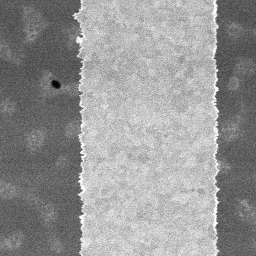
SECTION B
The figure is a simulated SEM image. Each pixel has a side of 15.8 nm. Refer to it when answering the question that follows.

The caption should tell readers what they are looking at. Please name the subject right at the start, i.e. one or a few lines or trenches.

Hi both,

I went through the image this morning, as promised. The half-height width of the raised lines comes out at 2140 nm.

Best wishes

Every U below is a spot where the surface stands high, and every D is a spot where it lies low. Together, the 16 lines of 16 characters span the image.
DDDDDUUUUUUUUUDD
DDDDDUUUUUUUUDDD
DDDDDUUUUUUUUDDD
DDDDDUUUUUUUUDDD
DDDDDUUUUUUUUUDD
DDDDDUUUUUUUUDDD
DDDDDUUUUUUUUDDD
DDDDDUUUUUUUUUDD
DDDDDUUUUUUUUUDD
DDDDDUUUUUUUUDDD
DDDDDUUUUUUUUUDD
DDDDDUUUUUUUUDDD
DDDDDUUUUUUUUUDD
DDDDDUUUUUUUUDDD
DDDDDUUUUUUUUDDD
DDDDDUUUUUUUUUDD